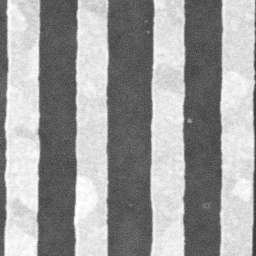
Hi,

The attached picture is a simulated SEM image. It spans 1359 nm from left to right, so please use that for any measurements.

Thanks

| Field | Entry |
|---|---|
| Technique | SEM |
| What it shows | lines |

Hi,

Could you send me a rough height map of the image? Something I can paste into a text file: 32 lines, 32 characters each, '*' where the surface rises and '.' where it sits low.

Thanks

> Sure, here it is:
.****.....***......****.....****
.****.....***......****.....****
.****.....***......****.....****
.****.....***......****.....****
.****.....***......****.....****
.****.....***......****.....****
.****.....***......****.....****
.****.....***......****.....****
.****.....***......****.....****
.****.....***......****.....****
.****.....***......****.....****
.****.....***......****.....****
.****.....***......****.....****
.****.....***......****.....****
.****.....***......****.....****
.****.....***......****.....****
.****.....***......****.....****
.****.....***......****.....****
.****.....***......****.....****
.****.....***......****.....****
.****.....***......****.....****
.****.....***......****.....****
.****.....***......****.....****
.****.....***......****.....****
.****.....***......****.....****
.****....****......****.....****
.****....****......****.....****
.****....****......****.....****
.****....****......****.....****
.****.....***......****.....***.
.****....****......****.....***.
.****....****......****.....***.